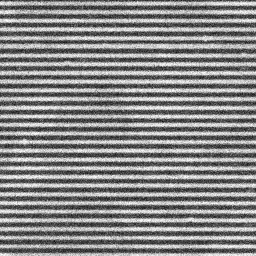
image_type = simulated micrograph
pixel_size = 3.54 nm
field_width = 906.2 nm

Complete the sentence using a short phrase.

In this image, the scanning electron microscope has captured parallel lines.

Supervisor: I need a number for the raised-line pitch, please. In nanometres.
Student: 30.6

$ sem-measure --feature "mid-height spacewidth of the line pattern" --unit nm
19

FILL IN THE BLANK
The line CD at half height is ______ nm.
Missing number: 12.4